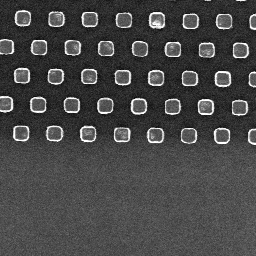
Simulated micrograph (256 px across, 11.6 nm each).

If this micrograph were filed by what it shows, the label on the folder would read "a regular array of raised bodies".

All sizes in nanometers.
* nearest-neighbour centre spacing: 381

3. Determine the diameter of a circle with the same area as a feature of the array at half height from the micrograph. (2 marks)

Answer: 190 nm